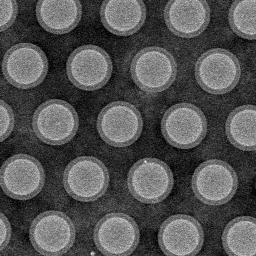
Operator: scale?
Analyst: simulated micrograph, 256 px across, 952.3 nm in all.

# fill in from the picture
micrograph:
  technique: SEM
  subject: an array of small figures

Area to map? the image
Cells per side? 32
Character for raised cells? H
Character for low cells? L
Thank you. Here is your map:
HHLLLHHHHHLLLHHHHHLLLHHHHHLLLHHH
HHLLHHHHHHLLLHHHHHLLLHHHHHLLLHHH
HHLLLHHHHHLLLHHHHHLLLHHHHHLLLHHH
HLLLLHHHHLLLLHHHHHLLLHHHHHLLLHHH
LLLLLLLLLLLLLLLLLLLLLLHHLLLLLLHH
LLHHLLLLLLLLLLLLLLLLLLLLLLLLLLLL
LHHHHLLLLHHHHLLLLHHHHLLLLLHHHLLL
HHHHHHLLHHHHHHLLLHHHHHLLLHHHHHLL
HHHHHHLLHHHHHHLLHHHHHHLLHHHHHHLL
LHHHHHLLHHHHHHLLHHHHHHLLHHHHHHLL
LHHHHLLLLHHHHLLLLHHHHLLLLHHHHHLL
LLLLLLLLLLLLLLLLLLLHLLLLLLHHLLLL
LLLLLLHHLLLLLLLLLLLLLLLLLLLLLLLL
HLLLLHHHHLLLLHHHHLLLLHHHHLLLLLHH
HHLLHHHHHHLLHHHHHHLLHHHHHHLLLHHH
HHLLHHHHHHLLHHHHHHLLHHHHHHLLHHHH
HLLLHHHHHHLLHHHHHHLLHHHHHHLLHHHH
LLLLLHHHHLLLLHHHHLLLLHHHHLLLLHHH
LLLLLLLLLLLLLLLLLLLLLLHHLLLLLLHH
LLHHLLLLLLLLLLLLLLLLLLLLLLLLLLLL
HHHHHLLLLHHHHLLLLHHHHLLLLHHHHLLL
HHHHHHLLHHHHHHLLHHHHHLLLHHHHHLLL
HHHHHHLLHHHHHHLLHHHHHHLLHHHHHHLL
HHHHHLLLHHHHHLLLHHHHHHLLHHHHHHLL
LHHHLLLLLHHHHLLLLHHHHLLLHHHHHLLL
LLLLLLLLLLLLLLLLLLLLLLLLLLHHLLLL
LLLLLLHHLLLLLLLLLLLLLLLLLLLLLLLL
HLLLHHHHHLLLHHHHHLLLLHHHHLLLLHHH
HLLLHHHHHLLLHHHHHLLLHHHHHLLLHHHH
HLLLHHHHHLLLHHHHHLLLHHHHHLLLHHHH
HLLLHHHHHLLLHHHHHLLLHHHHHLLLHHHH
LLLLLHHHLLLLLHHHHLLLHHHHHLLLHHHH